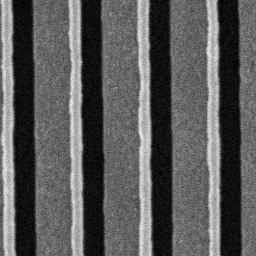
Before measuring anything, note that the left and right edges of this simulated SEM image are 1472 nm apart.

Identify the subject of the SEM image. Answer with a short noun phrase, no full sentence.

lines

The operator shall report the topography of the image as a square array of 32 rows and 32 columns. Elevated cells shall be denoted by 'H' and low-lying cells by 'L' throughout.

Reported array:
HLLLHHHHHHLLLHHHHHHLLHHHHHHLLLHH
HHLLHHHHHHLLLHHHHHHLLHHHHHHLLLHH
HHLLHHHHHHLLLHHHHHHLLHHHHHHLLLHH
HHLLHHHHHHLLLHHHHHHLLHHHHHHLLLHH
HHLLHHHHHHLLLHHHHHHLLHHHHHHLLLHH
HHLLHHHHHHLLLHHHHHHLLHHHHHHLLLHH
HHLLHHHHHHLLLHHHHHHLLHHHHHHLLLHH
HHLLHHHHHHLLLHHHHHHLLHHHHHHLLLHH
HHLLHHHHHHLLLHHHHHHLLLHHHHHLLLHH
HHLLHHHHHHLLLHHHHHHLLLHHHHHLLLHH
HHLLHHHHHHLLLHHHHHHLLLHHHHHLLLHH
HHLLHHHHHHLLLHHHHHHLLLHHHHHLLLHH
HHLLHHHHHHLLLHHHHHHLLLHHHHHLLLHH
HHLLHHHHHHLLLHHHHHHLLLHHHHHLLLHH
HHLLHHHHHHLLLHHHHHHLLLHHHHHLLLHH
HHLLHHHHHHLLLHHHHHHLLLHHHHHLLLHH
HHLLHHHHHHLLLHHHHHHLLLHHHHHLLLHH
HHLLHHHHHHLLLHHHHHHLLLHHHHHLLLHH
HHLLHHHHHHLLLHHHHHHLLLHHHHHLLLHH
HHLLLHHHHHLLLHHHHHHLLLHHHHHLLLHH
HHLLLHHHHHLLLHHHHHHLLLHHHHHLLLHH
HHLLLHHHHHLLLHHHHHHLLLHHHHHLLLHH
HHLLLHHHHHLLLHHHHHHLLLHHHHHLLLHH
HHLLLHHHHHLLLHHHHHHLLLHHHHHLLLHH
HHLLLHHHHHLLLHHHHHHLLLHHHHHLLLHH
HHLLLHHHHHLLLHHHHHHLLLHHHHHLLLHH
HHLLLHHHHHLLLHHHHHHLLLHHHHHLLLHH
HHLLLHHHHHLLLHHHHHHLLLHHHHHLLLHH
HHLLLHHHHHLLLHHHHHHLLLHHHHHLLLHH
HHLLLHHHHHLLLHHHHHHLLLHHHHHLLLHH
HHLLLHHHHHLLLHHHHHHLLLHHHHHLLLHH
HHLLLHHHHHLLLHHHHHHLLLHHHHHLLLHH